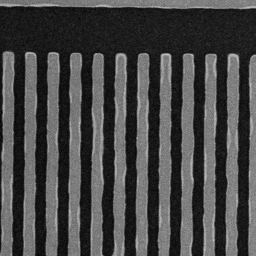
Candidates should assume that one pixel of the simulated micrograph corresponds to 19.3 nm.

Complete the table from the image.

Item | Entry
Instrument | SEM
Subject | groups of lines, slits or small figures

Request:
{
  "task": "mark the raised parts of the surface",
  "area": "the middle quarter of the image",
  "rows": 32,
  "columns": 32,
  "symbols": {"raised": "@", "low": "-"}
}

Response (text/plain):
--@@---@@@---@@----@@----@----@@
--@@---@@@---@@----@@----@----@@
--@@---@@@---@@----@@----@----@@
--@@---@@@---@@----@@----@----@@
--@@---@@@---@@----@@---@@@---@@
--@@---@@@---@@----@@---@@@---@@
--@@---@@@---@@----@@---@@@---@@
--@@---@@@---@@----@@---@@@---@@
--@@---@@@---@@----@@---@@@---@@
--@@---@@@---@@----@@---@@@---@@
--@@---@@@---@@----@@---@@@---@@
--@@---@@----@@----@@---@@@---@@
--@@---@@@---@@----@@---@@@---@@
--@@---@@@---@@----@----@@@---@@
--@@----@@---@@----@@---@@@---@@
--@@----@----@@----@@---@@@---@@
--@@----@----@@----@@---@@@---@@
--@@----@----@@---@@@---@@----@@
--@@----@----@@---@@@---@@----@@
--@@----@----@@---@@@---@@----@@
--@@----@----@@---@@@---@@@---@@
-@@@---@@----@@---@@@---@@----@@
-@@@---@@----@@---@@@---@@----@@
--@@---@@----@@---@@@---@@@---@@
--@@---@@----@@---@@@---@@@---@@
--@@---@@----@@---@@@---@@@---@@
--@@---@@----@@---@@@---@@@---@@
--@@---@@----@@----@@---@@@---@@
-@@@---@@----@@----@@---@@----@@
-@@@---@@@---@@----@@---@@----@@
-@@@---@@@---@@---@@@---@@----@@
-@@@---@@@---@@---@@@---@@----@@